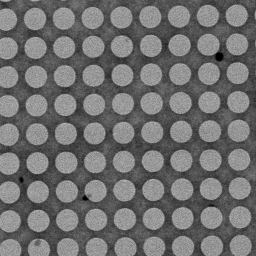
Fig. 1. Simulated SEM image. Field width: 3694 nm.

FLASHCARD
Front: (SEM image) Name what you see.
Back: an array of small figures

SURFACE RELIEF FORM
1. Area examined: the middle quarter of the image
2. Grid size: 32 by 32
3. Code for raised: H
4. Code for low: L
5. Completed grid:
HLLLLLHHLLLLLHHHLLLLHHHLLLLHHHHL
HHLLLHHHHHLLHHHHHLLHHHHHLLLHHHHL
HHHLLHHHHHLLHHHHHLLHHHHHLLLHHHHH
HHHLLHHHHHLLHHHHHLLHHHHHLLLHHHHL
HHLLLHHHHHLLLHHHHLLLHHHHLLLHHHHL
HLLLLLLLLLLLLLLLLLLLLLLLLLLLLLLL
LLLLLLLLLLLLLLLLLLLLLLLLLLLLLLLL
LLLLLLLLLLLLLLHHLLLLLHHLLLLLHHLL
HHLLLLHHHHLLLHHHHLLLHHHHLLLHHHHL
HHHLLHHHHHLLHHHHHLLHHHHHLLLHHHHH
HHHLLHHHHHLLHHHHHLLHHHHHHLLHHHHH
HHHLLHHHHHLLLHHHHLLLHHHHLLLHHHHL
HHLLLLHHHLLLLLHHLLLLLLLLLLLLLLLL
LLLLLLLLLLLLLLLLLLLLLLLLLLLLLLLL
LLLLLLLLLLLLLLLLLLLLLLLLLLLLHHLL
HHLLLLHHHLLLLHHHHLLLHHHHLLLHHHHL
HHHLLHHHHHLLHHHHHLLLHHHHHLLHHHHH
HHHLLHHHHHLLHHHHHLLLHHHHHLLHHHHH
HHHLLHHHHHLLLHHHHLLLHHHHLLLHHHHL
HHLLLLHHHLLLLLHHLLLLLHHLLLLLHLLL
LLLLLLLLLLLLLLLLLLLLLLLLLLLLLLLL
LLLLLLLLLLLLLLLLLLLLLLLLLLLLLLLL
HHLLLLHHHLLLLHHHHLLLHHHHLLLHHHHL
HHHLLHHHHHLLHHHHHLLLHHHHHLLHHHHH
HHHLLHHHHHLLHHHHHHLLHHHHHLLHHHHH
HHHLLHHHHHLLHHHHHLLLHHHHLLLHHHHH
HHLLLLHHHHLLLHHHLLLLLHHLLLLLHHHL
LLLLLLLLLLLLLLLLLLLLLLLLLLLLLLLL
LLLLLLLLLLLLLLLLLLLLLLLLLLLLLLLL
HHLLLLHHHLLLLLHHHLLLLHHHLLLLHHHL
HHHLLLHHHHLLLHHHHLLLHHHHHLLHHHHH
HHHLLHHHHHLLHHHHHHLLHHHHHLLHHHHH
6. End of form